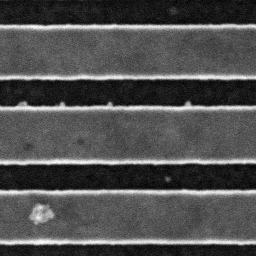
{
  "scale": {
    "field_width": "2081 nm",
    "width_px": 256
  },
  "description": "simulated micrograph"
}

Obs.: lines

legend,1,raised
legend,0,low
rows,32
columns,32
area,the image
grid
00000000000000000000000000000000
00000000000000000000000000000000
00000000000000000000000000000000
11111111111111111111111111111111
11111111111111111111111111111111
11111111111111111111111111111111
11111111111111111111111111111111
11111111111111111111111111111111
11111111111111111111111111111111
11111111111111111111111111111111
00000000000000000000000000000000
00000000000000000000000000000000
00000000000000000000000000000000
11111111111111111111111111111111
11111111111111111111111111111111
11111111111111111111111111111111
11111111111111111111111111111111
11111111111111111111111111111111
11111111111111111111111111111111
11111111111111111111111111111111
10110010000001100000000000000000
00000000000000000000000000000000
00000000000000000000000000000000
00000000000000000000000000000000
11111111111111111111111111111111
11111111111111111111111111111111
11111111111111111111111111111111
11111111111111111111111111111111
11111111111111111111111111111111
11111111111111111111111111111111
11001001001000100000000000000110
00000000000000000000000000000000